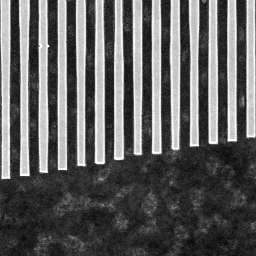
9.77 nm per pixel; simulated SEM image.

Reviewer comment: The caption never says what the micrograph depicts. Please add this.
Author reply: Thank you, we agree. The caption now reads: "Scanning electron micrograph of parallel lines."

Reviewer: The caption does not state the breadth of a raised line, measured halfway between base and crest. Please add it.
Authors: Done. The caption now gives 76.9 nm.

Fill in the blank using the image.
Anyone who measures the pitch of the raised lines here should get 0.184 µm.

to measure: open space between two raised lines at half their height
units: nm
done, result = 104